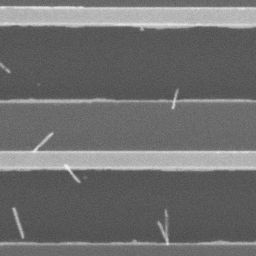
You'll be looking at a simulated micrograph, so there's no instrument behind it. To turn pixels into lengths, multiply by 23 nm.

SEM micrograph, lines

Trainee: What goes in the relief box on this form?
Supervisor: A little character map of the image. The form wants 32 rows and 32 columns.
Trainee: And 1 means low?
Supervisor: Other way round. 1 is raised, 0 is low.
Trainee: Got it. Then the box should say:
11111111111111111111111111111111
11111111111111111111111111111111
11111111111111111111111111111111
00000000000000000000000000000000
00000000000000000000000000000000
00000000000000000000000000000000
00000000000000000000000000000000
00000000000000000000000000000000
00000000000000000000000000000000
00000000000000000000000000000000
00000000000000000000000000000000
00000000000000000000000000000000
00000000000000000000000000000000
11111111111111111111111111111111
11111111111111111111111111111111
11111111111111111111111111111111
11111111111111111111111111111111
11111111111111111111111111111111
11111111111111111111111111111111
11111111111111111111111111111111
11111111111111111111111111111111
00000000000000000000000000000000
00000000000000000000000000000000
00000000000000000000000000000000
00000000000000000000000000000000
00000000000000000000000000000000
00000000000000000000000000000000
00000000000000000000000000000000
00000000000000000000000000000000
00000000000000000000000000000000
00000000011000111111101111111111
11111111111111111111111111111111